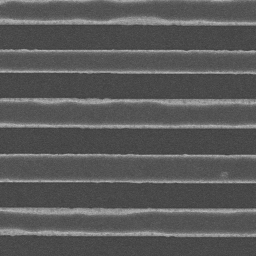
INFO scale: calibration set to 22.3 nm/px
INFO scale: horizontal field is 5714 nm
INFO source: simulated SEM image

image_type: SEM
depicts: lines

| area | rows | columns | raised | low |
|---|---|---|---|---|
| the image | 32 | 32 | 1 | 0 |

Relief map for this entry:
11111111111111111111111111111111
11111111111111111111111111111111
11111111111111111111111111111111
00000000000000000000000000000000
00000000000000000000000000000000
00000000000000000000000000000000
11111111111111111111111111111111
11111111111111111111111111111111
11111111111111111111111111111111
00000000000000000000000000000000
00000000000000000000000000000000
00000000000000000000000000000000
11111000110000000010000000000000
11111111111111111111111111111111
11111111111111111111111111111111
11111111111111111111111111111111
00000000000000000000000000000000
00000000000000000000000000000000
00000000000000000000000000000000
11111111111111111111111111111111
11111111111111111111111111111111
11111111111111111111111111111111
11111111111111111111111111111111
00000000000000000000000000000000
00000000000000000000000000000000
00000000000000000000000000000000
11111111111111111111111111111111
11111111111111111111111111111111
11111111111111111111111111111111
00000000000000000000000000000000
00000000000000000000000000000000
00000000000000000000000000000000